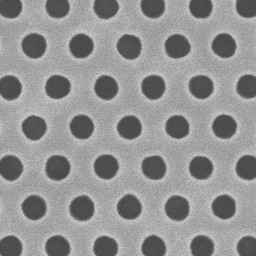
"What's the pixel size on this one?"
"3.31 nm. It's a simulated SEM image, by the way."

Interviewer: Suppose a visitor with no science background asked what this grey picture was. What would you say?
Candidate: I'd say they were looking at a regular array of holes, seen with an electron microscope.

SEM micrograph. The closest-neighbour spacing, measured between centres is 154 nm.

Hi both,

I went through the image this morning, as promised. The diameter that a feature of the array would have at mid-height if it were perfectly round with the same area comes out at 78.5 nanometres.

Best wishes